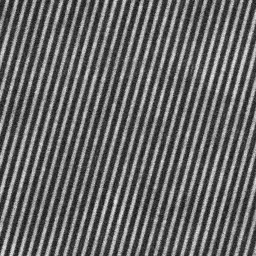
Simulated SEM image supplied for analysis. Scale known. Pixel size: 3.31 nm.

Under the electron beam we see parallel lines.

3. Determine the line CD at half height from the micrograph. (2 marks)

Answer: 7.2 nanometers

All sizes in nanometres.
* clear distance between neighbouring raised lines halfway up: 22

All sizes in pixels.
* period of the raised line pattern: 8.7